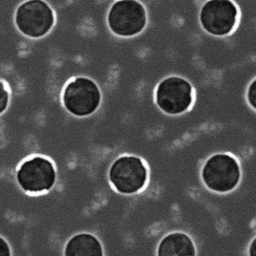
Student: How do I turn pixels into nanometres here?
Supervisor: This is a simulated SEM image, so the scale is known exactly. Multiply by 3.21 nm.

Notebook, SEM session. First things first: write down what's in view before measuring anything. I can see holes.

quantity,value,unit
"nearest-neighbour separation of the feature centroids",90.4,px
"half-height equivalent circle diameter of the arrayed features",0.119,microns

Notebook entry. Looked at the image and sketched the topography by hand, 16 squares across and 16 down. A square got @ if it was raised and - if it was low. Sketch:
@--@@@@--@@@@--@
@--@@@@--@@@@--@
@@@@@@@@@@@@@@@@
@@@@@@@@@@@@@@@@
@@@@@@@@@@@@@@@@
@@@@--@@@@--@@@@
@@@@--@@@@--@@@@
@@@@@@@@@@@@@@@@
@@@@@@@@@@@@@@@@
@@@@@@@@@@@@@@@@
@--@@@@--@@@@--@
@--@@@@--@@@@--@
@@@@@@@@@@@@@@@@
@@@@@@@@@@@@@@@@
@@@@@@@@@@@@@@@@
-@@@--@@@@--@@@@